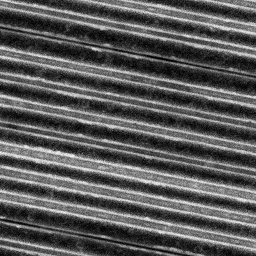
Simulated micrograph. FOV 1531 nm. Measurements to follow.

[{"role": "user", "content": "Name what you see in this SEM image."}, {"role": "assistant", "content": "parallel lines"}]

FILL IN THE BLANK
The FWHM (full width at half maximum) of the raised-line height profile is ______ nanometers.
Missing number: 104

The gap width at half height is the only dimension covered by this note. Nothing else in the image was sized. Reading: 0.0411 µm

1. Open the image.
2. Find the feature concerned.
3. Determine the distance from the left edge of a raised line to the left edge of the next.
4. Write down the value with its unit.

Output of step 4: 141 nm